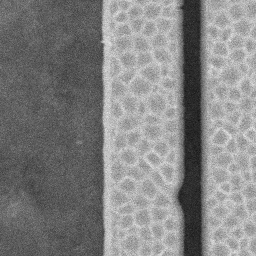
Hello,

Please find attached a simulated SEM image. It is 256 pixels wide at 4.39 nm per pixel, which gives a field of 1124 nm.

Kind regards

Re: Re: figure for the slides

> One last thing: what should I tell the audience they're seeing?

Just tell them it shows one or a few lines or trenches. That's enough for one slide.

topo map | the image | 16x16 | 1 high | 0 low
0000000111100111
0000000111100111
0000000111100111
0000000111100111
0000000111100111
0000000111100111
0000000111100111
0000000111100111
0000000111100111
0000000111100111
0000000111100111
0000000111100111
0000000111100111
0000000111100111
0000000111100111
0000000111100111